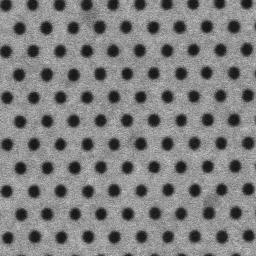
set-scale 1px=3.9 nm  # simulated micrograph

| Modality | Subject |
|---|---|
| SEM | a regular array of holes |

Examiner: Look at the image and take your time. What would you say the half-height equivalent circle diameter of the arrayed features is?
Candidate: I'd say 47.2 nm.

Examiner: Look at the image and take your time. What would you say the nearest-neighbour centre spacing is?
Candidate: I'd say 26.4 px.